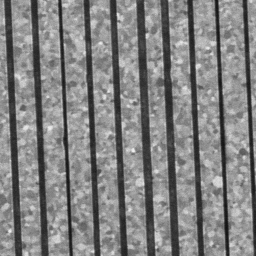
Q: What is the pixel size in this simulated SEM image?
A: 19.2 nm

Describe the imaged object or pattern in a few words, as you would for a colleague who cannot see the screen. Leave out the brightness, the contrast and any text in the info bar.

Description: parallel lines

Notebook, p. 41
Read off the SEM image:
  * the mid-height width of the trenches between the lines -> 134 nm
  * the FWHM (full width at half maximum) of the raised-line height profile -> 19.5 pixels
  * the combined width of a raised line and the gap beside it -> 504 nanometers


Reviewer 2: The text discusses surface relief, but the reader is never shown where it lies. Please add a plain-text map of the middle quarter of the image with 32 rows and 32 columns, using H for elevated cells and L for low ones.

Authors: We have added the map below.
HHHHHLLHHHHHLLHHHHHLLHHHHLLHHHHL
HHHHHLLHHHHHLLHHHHHLLHHHHLLHHHHL
HHHHHLLHHHHHLLHHHHHLLHHHHLLHHHHL
LHHHHLLHHHHHLLHHHHHLLHHHHLLHHHHL
LHHHHLLHHHHHLLHHHHHLLHHHHLLHHHHH
LHHHHLLHHHHHLLHHHHHLLHHHHLLHHHHH
LHHHHHLLHHHHLLHHHHHLLHHHHLLHHHHH
LHHHHHLLHHHHLLHHHHHLLHHHHLLHHHHH
LHHHHHLLHHHHLLHHHHHLLHHHHLLHHHHH
LHHHHHLLHHHHLLHHHHHLLHHHHLLHHHHH
LHHHHHLLHHHHLLLHHHHLLHHHHLLHHHHH
LHHHHHLLHHHHLLHHHHHLLHHHHLLHHHHH
LHHHHHLLHHHHLLHHHHHLLHHHHLLHHHHH
LHHHHHLLHHHHLLHHHHHLLLHHHLLHHHHH
LHHHHHLLHHHHHLHHHHHLLLHHHLLLHHHH
LHHHHHLLHHHHHLLHHHHLLLHHHLLLHHHH
LHHHHHLLHHHHHLLHHHHLLLHHHLLLHHHH
LHHHHHLLHHHHHLLHHHHLLLHHHLLLHHHH
LHHHHHLLHHHHHLLHHHHLLLHHHLLLHHHH
LHHHHHLLHHHHHLLHHHHLLLHHHLLLHHHH
LHHHHHLLHHHHHLLHHHHLLLHHHLLLHHHH
LHHHHHLLHHHHHLLHHHHLLLHHHLLLHHHH
LHHHHHLLHHHHHLLHHHHLLLHHHLLLHHHH
LHHHHHHLHHHHHLLHHHHHLLHHHLLLHHHH
LHHHHHHLHHHHHLLHHHHHLLHHHHLLHHHH
LLHHHHHLHHHHHLLHHHHHLLHHHHLLHHHH
LLHHHHHLHHHHHLLHHHHHLLHHHHLLHHHH
LLHHHHHLHHHHHLLHHHHHLLHHHHLLHHHH
LLHHHHHLHHHHHLLHHHHHLLHHHHLLHHHH
LLHHHHHLLHHHHLLHHHHHLLHHHHLLHHHH
LLHHHHHLLHHHHLLHHHHHLLHHHHLLHHHH
LLHHHHHLLHHHHLLHHHHHLLHHHHLLHHHH